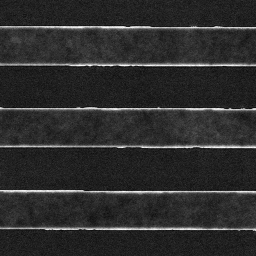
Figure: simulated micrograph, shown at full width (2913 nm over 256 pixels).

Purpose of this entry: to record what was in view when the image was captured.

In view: lines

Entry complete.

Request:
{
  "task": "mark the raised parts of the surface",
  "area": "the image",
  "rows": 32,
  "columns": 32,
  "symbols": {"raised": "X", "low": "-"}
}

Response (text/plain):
--------------------------------
--------------------------------
--------------------------------
XXXXXXXXXXXXXXXXXXXXXXXXXXXXXXXX
XXXXXXXXXXXXXXXXXXXXXXXXXXXXXXXX
XXXXXXXXXXXXXXXXXXXXXXXXXXXXXXXX
XXXXXXXXXXXXXXXXXXXXXXXXXXXXXXXX
XXXXXXXXXXXXXXXXXXXXXXXXXXXXXXXX
--------------------------------
--------------------------------
--------------------------------
--------------------------------
--------------------------------
--------------------------------
XXXXXXXXXXXXXXXXXXXXXXXXXXXXXXXX
XXXXXXXXXXXXXXXXXXXXXXXXXXXXXXXX
XXXXXXXXXXXXXXXXXXXXXXXXXXXXXXXX
XXXXXXXXXXXXXXXXXXXXXXXXXXXXXXXX
--------------------------------
--------------------------------
--------------------------------
--------------------------------
--------------------------------
--------------------------------
XXXXXXXXXXXXXXXXXXXXXXXXXXXXXXXX
XXXXXXXXXXXXXXXXXXXXXXXXXXXXXXXX
XXXXXXXXXXXXXXXXXXXXXXXXXXXXXXXX
XXXXXXXXXXXXXXXXXXXXXXXXXXXXXXXX
XXXXXXXXXXXXXXXXXXXXXXXXXXXXXXXX
--------------------------------
--------------------------------
--------------------------------